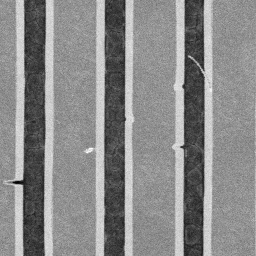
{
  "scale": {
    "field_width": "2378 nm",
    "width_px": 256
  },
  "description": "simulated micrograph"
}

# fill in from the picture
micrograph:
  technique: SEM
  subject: one or a few lines or trenches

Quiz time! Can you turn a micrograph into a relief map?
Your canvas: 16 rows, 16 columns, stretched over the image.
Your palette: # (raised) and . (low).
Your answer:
#..###..###..###
#..###..###..###
#..###..###..###
#..###..###..###
#..###..###..###
#..###..###..###
#..###..###..###
#..###..###..###
#..###..###..###
#..###..###..###
#..###..###..###
#..###..###..###
#..###..###..###
#..###..###..###
#..###..###..###
#..###..###..###